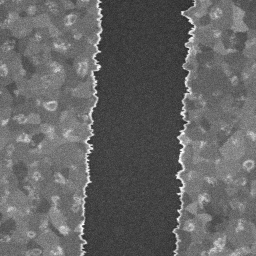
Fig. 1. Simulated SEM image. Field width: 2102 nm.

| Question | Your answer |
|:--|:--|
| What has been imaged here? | one or a few lines or trenches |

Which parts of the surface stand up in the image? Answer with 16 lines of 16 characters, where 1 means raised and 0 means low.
1111110000001111
1111110000001111
1111110000001111
1111110000001111
1111110000001111
1111110000001111
1111110000011111
1111110000001111
1111110000011111
1111110000011111
1111100000011111
1111100000011111
1111100000011111
1111100000011111
1111100000011111
1111100000011111